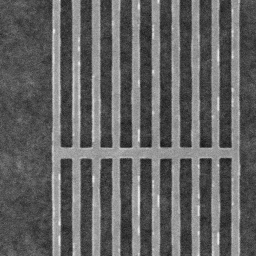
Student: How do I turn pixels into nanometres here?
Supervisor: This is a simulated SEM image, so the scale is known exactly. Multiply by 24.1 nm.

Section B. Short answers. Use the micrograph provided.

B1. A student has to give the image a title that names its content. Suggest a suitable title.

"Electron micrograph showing groups of lines, slits or small figures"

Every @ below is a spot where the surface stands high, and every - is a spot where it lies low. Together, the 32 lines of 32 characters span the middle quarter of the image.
--@@---@@---@@---@@---@@---@@---
--@@---@@---@@---@@---@@---@@---
--@@---@@---@@---@@---@@---@@---
--@@---@@---@@---@@---@@---@@---
--@@---@@---@@---@@---@@---@@---
--@@---@@---@@---@@---@@---@@---
--@@---@@---@@---@@---@@---@@---
--@@---@@---@@---@@---@@---@@---
--@@---@@---@@---@@---@@---@@---
--@@---@@---@@---@@---@@---@@---
--@@---@@---@@---@@---@@---@@---
--@@---@@---@@---@@---@@---@@---
--@@---@@---@@---@@---@@---@@---
--@@---@@---@@---@@---@@---@@---
--@@---@@---@@---@@---@@---@@---
--@@---@@---@@---@@---@@---@@---
--@@---@@---@@---@@---@@---@@---
--@@---@@---@@---@@---@@---@@---
--@@---@@---@@---@@---@@---@@---
--@@---@@---@@---@@---@@---@@---
--@@---@@---@@---@@---@@---@@---
@@@@@@@@@@@@@@@@@@@@@@@@@@@@@@@@
@@@@@@@@@@@@@@@@@@@@@@@@@@@@@@@@
--@@@--@@---@@---@@---@@---@@---
--@@---@@---@@---@@---@@---@@---
--@@---@@---@@---@@---@@---@@---
--@@---@@---@@---@@---@@---@@---
--@@---@@---@@---@@---@@---@@---
--@@---@@---@@---@@---@@---@@---
--@@---@@---@@---@@---@@---@@---
--@@---@@---@@---@@---@@---@@---
--@@---@@---@@---@@---@@---@@---